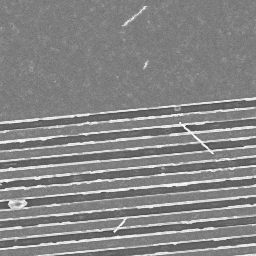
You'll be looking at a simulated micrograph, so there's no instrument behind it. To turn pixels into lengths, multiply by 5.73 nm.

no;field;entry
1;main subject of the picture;parallel lines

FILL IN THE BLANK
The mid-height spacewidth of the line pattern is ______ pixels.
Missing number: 6.96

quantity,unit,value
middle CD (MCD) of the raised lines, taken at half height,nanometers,69.9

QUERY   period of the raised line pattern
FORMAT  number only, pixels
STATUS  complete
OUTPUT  19.4